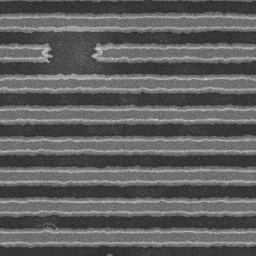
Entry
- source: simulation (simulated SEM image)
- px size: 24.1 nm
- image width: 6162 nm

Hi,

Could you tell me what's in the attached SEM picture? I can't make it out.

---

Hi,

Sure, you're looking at parallel lines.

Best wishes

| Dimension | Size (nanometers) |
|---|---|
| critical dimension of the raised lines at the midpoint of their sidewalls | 334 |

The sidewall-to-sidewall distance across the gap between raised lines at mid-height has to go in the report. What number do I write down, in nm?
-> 403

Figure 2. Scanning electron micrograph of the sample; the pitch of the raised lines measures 739 nanometres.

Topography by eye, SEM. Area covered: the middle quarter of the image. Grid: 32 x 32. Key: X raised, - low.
--------------------------------
--------------------------------
--------------------------------
XXXXXXXXXXXXXXXXXXXXXXXXXXXXXXXX
XXXXXXXXXXXXXXXXXXXXXXXXXXXXXXXX
XXXXXXXXXXXXXXXXXXXXXXXXXXXXXXXX
--X----X------XXXXX-XXX-XXXXXXXX
--------------------------------
--------------------------------
--------------------------------
--------------------------------
XXXXXXXXXXXXXXXXXXXXXXXXXXXXXXXX
XXXXXXXXXXXXXXXXXXXXXXXXXXXXXXXX
XXXXXXXXXXXXXXXXXXXXXXXXXXXXXXXX
------XX-XXXX-----------------X-
--------------------------------
--------------------------------
--------------------------------
--------------------------------
XXXXXXXXXXXXXXXXXXXXXXXXXXXXXXXX
XXXXXXXXXXXXXXXXXXXXXXXXXXXXXXXX
XXXXXXXXXXXXXXXXXXXXXXXXXXXXXXXX
--------------------------------
--------------------------------
--------------------------------
--------------------------------
XXX--XXX--XXXXXXXXXXX-XXXXXXXXXX
XXXXXXXXXXXXXXXXXXXXXXXXXXXXXXXX
XXXXXXXXXXXXXXXXXXXXXXXXXXXXXXXX
XXXXXXXXXXXXXXXXXXXXXXXXXXXXXXXX
--------------------------------
--------------------------------